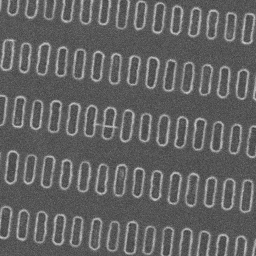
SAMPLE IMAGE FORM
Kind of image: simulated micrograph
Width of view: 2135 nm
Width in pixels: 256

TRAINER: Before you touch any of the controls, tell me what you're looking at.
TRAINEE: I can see a regular array of holes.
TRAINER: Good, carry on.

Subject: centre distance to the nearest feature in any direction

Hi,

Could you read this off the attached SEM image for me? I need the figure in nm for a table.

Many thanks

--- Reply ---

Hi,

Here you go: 150